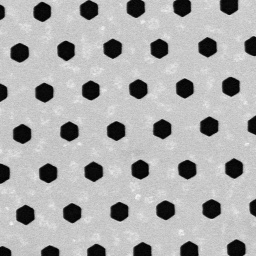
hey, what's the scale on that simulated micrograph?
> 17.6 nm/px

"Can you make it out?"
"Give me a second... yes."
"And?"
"a regular array of holes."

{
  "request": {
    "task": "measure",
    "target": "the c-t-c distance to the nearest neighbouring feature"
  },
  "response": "0.809 micrometres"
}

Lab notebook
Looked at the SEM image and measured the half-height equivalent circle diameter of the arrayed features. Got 333 nm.